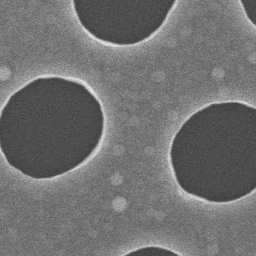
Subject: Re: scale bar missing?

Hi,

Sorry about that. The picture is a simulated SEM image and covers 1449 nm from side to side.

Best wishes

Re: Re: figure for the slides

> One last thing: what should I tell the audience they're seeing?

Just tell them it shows holes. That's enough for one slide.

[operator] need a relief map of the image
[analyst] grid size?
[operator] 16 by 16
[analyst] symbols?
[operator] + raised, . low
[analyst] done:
+++++......++++.
+++++.....++++++
++++++...+++++++
++++++++++++++++
++++++++++++++++
+....+++++++++++
......+++++++..+
......++++++....
......+++++.....
......+++++.....
+....++++++.....
+++++++++++.....
+++++++++++++..+
++++++++++++++++
++++++++++++++++
+++++++++.++++++